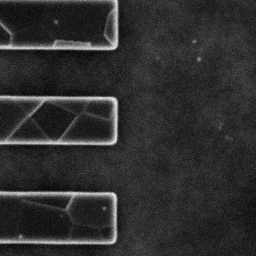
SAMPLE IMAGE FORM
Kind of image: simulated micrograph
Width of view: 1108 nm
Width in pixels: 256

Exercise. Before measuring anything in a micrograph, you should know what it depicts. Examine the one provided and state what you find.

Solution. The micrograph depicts wiring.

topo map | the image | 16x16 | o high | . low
ooooooo.........
ooooooo.........
ooooooo.........
................
................
................
ooooooo.........
ooooooo.........
ooooooo.........
................
................
................
ooooooo.........
ooooooo.........
ooooooo.........
................